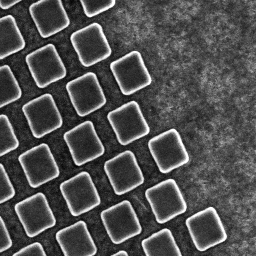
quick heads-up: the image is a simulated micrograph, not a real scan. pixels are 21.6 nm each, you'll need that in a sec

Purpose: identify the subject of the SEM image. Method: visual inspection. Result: a regular array of raised bodies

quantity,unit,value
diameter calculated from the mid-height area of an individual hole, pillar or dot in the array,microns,0.805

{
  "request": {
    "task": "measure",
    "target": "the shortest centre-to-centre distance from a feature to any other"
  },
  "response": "1060 nanometers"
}